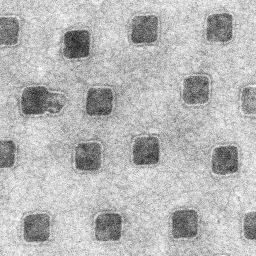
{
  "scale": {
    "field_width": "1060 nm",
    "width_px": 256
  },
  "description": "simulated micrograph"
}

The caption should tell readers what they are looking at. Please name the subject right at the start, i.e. a regular array of raised bodies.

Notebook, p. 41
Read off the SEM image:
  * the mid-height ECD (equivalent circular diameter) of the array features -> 32.2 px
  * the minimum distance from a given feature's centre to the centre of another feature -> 275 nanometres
